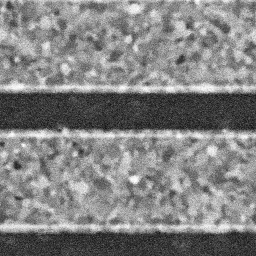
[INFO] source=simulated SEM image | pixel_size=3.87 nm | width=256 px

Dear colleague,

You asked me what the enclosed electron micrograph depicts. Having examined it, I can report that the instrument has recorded one or a few lines or trenches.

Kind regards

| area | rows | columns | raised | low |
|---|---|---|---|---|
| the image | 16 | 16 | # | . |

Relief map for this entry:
################
################
################
################
################
................
................
................
#####.........#.
################
################
################
################
################
................
................